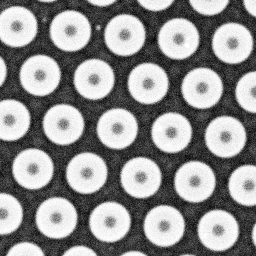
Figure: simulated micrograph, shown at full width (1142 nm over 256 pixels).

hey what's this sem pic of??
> an array of small figures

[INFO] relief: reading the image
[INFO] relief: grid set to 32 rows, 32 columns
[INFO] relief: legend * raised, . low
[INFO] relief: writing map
............**....***...****...*
****....*................**....*
****...****...***.....*.........
*****.*****..*****..****...****.
****..*****..*****..*****..****.
.**....****..*****..*****..*****
..............***...****...****.
...****....*................**..
*..****...****...***............
*..****..*****..*****..****....*
...****..*****..*****..*****..**
....**....****..*****..*****..**
.................***...****...**
***....**................*....**
****..****...****...***.........
****.*****..*****..*****..****..
***...****..*****..*****..*****.
.*....***....****..*****..*****.
..............*.....***...****..
..****....**...............**...
..*****..****...***....***......
..*****.*****..*****..*****..***
..****..*****..*****..*****..***
...**....***....****..*****..***
*................**....***...***
**...****....**...............**
***..****...****...***....**....
***..*****.*****..*****..****...
**...****..*****..*****..*****..
......**....***...*****..*****..
..**...............***...****...
.****...****....*...............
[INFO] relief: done